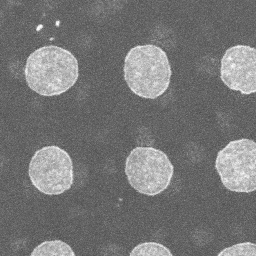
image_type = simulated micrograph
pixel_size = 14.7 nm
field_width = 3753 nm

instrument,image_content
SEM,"raised bodies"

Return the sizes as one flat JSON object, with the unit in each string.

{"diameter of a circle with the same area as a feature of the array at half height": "704 nm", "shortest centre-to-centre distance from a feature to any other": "1420 nanometres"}